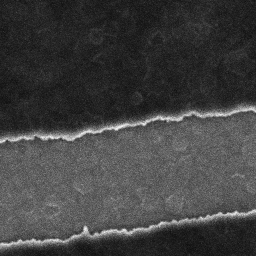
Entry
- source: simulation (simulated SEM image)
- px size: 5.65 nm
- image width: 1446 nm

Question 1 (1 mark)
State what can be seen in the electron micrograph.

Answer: one or a few lines or trenches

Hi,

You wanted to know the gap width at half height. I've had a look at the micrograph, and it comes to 566 nm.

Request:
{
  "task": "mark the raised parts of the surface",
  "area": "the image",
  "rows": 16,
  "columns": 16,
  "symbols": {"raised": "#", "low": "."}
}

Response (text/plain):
################
################
################
################
################
################
################
##########......
#####...........
................
................
................
................
.............###
......##########
################